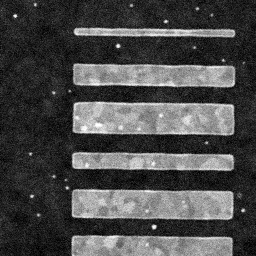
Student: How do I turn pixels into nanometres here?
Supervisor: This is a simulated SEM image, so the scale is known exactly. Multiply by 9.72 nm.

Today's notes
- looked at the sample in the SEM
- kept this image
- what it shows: groups of lines, slits or small figures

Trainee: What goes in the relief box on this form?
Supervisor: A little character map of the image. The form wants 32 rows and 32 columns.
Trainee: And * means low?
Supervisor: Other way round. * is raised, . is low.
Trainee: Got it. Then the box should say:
................................
................................
................................
................................
................................
................................
................................
................................
.........********************...
.........********************...
..........****.**************...
................................
................................
.........********************...
.........********************...
.........********************...
..........*******************...
................................
................................
.........********************...
.........********************...
................................
................................
................................
.........********************...
.........********************...
.........********************...
................................
................................
...........*....................
.........********************...
.........********************...